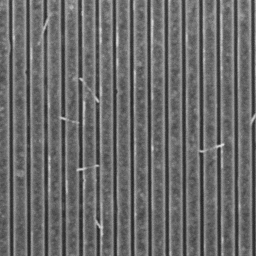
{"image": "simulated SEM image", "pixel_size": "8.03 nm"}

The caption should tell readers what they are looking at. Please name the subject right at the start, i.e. parallel lines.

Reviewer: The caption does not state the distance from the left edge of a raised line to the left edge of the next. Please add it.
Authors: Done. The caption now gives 0.139 um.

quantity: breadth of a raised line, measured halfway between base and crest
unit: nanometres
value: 109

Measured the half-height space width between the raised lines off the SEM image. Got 0.0301 micrometres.